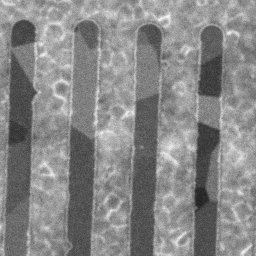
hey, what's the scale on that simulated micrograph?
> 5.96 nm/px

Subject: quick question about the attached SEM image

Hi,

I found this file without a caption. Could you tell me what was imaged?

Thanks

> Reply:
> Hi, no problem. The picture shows one or a few lines or trenches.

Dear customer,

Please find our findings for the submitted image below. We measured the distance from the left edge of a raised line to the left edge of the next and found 374 nanometres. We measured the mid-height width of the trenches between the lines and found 220 nm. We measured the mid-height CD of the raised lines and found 150 nm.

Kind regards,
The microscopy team